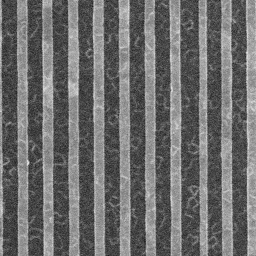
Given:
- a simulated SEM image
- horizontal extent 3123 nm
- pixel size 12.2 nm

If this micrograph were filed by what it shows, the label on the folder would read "parallel lines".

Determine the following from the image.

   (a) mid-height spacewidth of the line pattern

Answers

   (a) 192 nm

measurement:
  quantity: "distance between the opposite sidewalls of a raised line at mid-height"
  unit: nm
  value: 116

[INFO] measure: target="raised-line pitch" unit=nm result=312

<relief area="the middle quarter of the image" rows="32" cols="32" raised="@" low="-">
-@@@----@@----@@----@@@----@@---
-@@@----@@----@@----@@@----@@---
-@@@----@@----@@----@@@----@@---
-@@-----@@----@@----@@@----@@---
-@@-----@@----@@----@@@----@@---
-@@-----@@----@@----@@@----@@---
-@@-----@@----@@----@@@----@@---
-@@-----@@----@@----@@@----@@---
-@@-----@@----@@----@@@----@@---
-@@-----@@----@@----@@@----@@---
-@@-----@@----@@----@@@----@@---
-@@-----@@----@@----@@@----@@---
-@@-----@@----@@----@@@----@@---
-@@-----@@----@@----@@@----@@---
-@@-----@@----@@----@@@----@@---
-@@-----@@----@@----@@@----@@---
-@@@----@@----@@-----@@----@@---
-@@@----@@----@@-----@@----@@---
-@@@----@@----@@-----@@----@@---
-@@@----@@----@@-----@@----@@---
-@@@----@@----@@-----@@----@@---
-@@@----@@----@@-----@@----@@---
-@@@----@@----@@-----@@----@@---
-@@@----@@----@@-----@@----@@---
-@@@----@@----@@-----@@----@@---
-@@@----@@----@@-----@@----@@---
-@@@----@@----@@-----@@----@@---
-@@@----@@----@@----@@@----@@---
-@@@----@@----@@-----@@----@@---
-@@@----@@----@@-----@@----@@---
-@@@----@@----@@-----@@----@@---
-@@@----@@----@@-----@@----@@---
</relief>